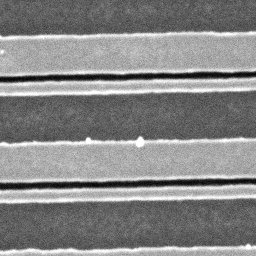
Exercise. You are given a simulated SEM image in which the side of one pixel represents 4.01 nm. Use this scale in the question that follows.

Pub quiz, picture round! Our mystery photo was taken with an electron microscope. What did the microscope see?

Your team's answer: lines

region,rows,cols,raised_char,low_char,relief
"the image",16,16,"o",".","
................
................
oooooooooooooooo
oooooooooooooooo
oooooooooooooooo
oooooooooooooooo
................
................
................
oooooooooooooooo
oooooooooooooooo
oooooooooooooooo
ooooooo.........
................
................
..........o.oooo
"